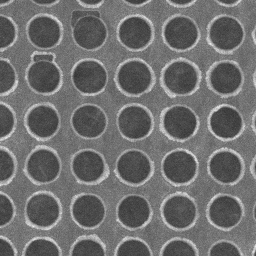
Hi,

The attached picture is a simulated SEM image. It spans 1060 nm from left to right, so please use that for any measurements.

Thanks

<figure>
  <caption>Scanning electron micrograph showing a regular array of holes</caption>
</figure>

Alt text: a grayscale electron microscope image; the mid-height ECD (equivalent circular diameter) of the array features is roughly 33.5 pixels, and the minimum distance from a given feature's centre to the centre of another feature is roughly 0.184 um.